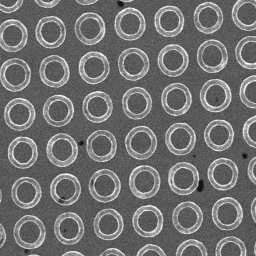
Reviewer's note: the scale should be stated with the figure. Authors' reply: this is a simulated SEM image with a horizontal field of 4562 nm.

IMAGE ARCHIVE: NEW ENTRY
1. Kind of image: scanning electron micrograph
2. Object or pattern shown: a regular array of ring-shaped raised bodies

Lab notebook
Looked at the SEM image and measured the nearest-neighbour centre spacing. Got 695 nm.